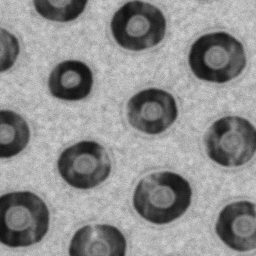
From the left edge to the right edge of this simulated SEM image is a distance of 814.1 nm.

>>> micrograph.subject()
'ring-shaped grooves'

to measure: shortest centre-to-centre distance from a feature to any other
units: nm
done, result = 270